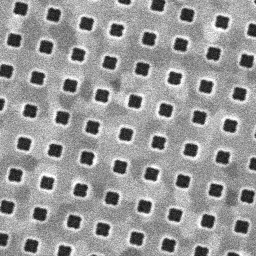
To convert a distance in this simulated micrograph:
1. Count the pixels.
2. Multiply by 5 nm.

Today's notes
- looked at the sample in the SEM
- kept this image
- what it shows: a regular array of holes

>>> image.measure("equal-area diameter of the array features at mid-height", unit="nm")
75.9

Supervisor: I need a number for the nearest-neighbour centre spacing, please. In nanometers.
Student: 160